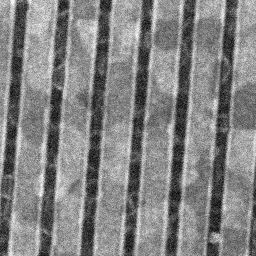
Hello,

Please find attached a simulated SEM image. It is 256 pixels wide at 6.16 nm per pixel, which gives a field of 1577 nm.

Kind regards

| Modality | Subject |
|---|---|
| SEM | parallel lines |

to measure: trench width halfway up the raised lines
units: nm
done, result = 85.2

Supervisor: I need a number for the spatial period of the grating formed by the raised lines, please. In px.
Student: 41.9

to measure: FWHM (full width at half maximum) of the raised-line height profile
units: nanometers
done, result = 171